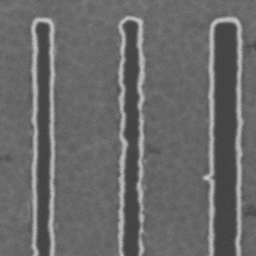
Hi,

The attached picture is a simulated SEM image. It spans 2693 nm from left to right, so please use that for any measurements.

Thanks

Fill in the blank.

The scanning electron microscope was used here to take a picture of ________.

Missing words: one or a few lines or trenches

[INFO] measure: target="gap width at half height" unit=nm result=734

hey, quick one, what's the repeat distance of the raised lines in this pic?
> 0.957 um